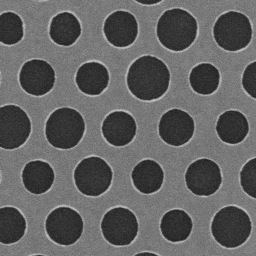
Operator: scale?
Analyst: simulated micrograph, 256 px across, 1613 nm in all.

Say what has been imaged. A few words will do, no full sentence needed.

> a regular array of holes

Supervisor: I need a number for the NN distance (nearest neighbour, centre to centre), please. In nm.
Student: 350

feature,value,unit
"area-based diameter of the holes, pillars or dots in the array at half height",0.232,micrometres